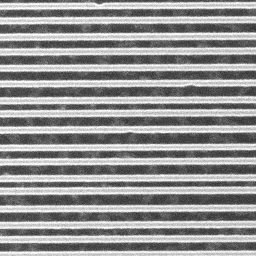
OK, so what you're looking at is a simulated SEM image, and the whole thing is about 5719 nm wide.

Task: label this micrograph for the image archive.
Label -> parallel lines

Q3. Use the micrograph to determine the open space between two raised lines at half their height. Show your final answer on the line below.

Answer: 10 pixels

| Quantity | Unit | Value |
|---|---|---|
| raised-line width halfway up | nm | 128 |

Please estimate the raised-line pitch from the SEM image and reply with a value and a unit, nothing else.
347 nanometers